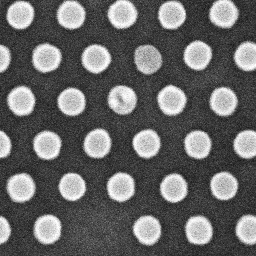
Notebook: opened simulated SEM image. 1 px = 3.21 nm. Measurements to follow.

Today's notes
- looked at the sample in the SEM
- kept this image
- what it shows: a regular array of raised bodies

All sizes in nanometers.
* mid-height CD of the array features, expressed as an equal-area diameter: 83.5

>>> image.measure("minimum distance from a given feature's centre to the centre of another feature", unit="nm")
157